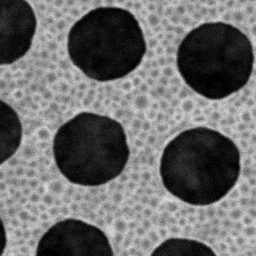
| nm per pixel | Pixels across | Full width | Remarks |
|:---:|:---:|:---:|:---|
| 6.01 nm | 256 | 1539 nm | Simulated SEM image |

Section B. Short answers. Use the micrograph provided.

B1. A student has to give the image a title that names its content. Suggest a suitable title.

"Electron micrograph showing holes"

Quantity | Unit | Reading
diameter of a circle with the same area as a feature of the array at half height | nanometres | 468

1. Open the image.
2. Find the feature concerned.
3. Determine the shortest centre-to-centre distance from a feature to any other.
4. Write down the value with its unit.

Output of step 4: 0.643 microns